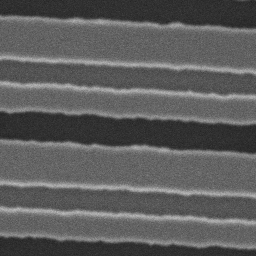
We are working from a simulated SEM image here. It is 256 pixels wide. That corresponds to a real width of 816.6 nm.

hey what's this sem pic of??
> lines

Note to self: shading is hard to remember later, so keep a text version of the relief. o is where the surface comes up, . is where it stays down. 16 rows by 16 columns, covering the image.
................
oooooooooo......
oooooooooooooooo
oooooooooooooooo
oooooooooooooooo
oooooooooooooooo
oooooooooooooooo
...........ooooo
................
oooooooooooooo..
oooooooooooooooo
oooooooooooooooo
oooooooooooooooo
oooooooooooooooo
oooooooooooooooo
...............o